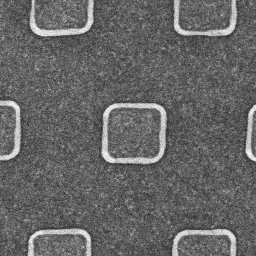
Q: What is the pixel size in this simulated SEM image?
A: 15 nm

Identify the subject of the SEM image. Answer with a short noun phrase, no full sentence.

raised bodies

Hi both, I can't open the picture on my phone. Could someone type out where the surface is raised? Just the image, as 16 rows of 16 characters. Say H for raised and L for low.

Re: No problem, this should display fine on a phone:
LLHHHHLLLLLHHHHL
LLHHHLLLLLLHHHHL
LLLLLLLLLLLLLLLL
LLLLLLLLLLLLLLLL
LLLLLLLLLLLLLLLL
LLLLLLLLLLLLLLLL
HLLLLLLLLLLLLLLL
HLLLLLLHHHLLLLLL
HLLLLLLHHHLLLLLL
HLLLLLLHHHLLLLLL
LLLLLLLLLLLLLLLL
LLLLLLLLLLLLLLLL
LLLLLLLLLLLLLLLL
LLLLLLLLLLLLLLLL
LLLHHLLLLLLLLLLL
LLHHHHLLLLLHHHHL